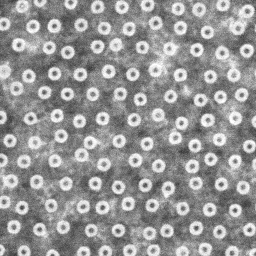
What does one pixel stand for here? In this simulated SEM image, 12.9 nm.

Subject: a regular array of ring-shaped raised bodies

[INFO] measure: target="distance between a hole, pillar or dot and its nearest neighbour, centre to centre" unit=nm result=276